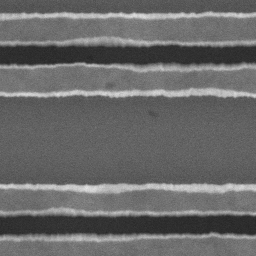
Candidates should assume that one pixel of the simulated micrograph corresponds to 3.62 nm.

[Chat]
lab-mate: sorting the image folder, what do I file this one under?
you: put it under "lines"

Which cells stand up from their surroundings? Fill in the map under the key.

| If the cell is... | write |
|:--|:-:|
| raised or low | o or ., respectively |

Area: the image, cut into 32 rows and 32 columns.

................................
................................
oooooooooooooooooooooooooooooooo
oooooooooooooooooooooooooooooooo
oooooooooooooooooooooooooooooooo
oooooooooooo.oooooooo.oooooooooo
................................
................................
oooooooooooooooooooooooooooooooo
oooooooooooooooooooooooooooooooo
oooooooooooooooooooooooooooooooo
oooooooooooooooooooooooooooooooo
................................
................................
................................
................................
................................
................................
................................
................................
................................
................................
................................
oooooooooooooooooooooooooooooooo
oooooooooooooooooooooooooooooooo
oooooooooooooooooooooooooooooooo
oooooooooooooooooooooooooooooooo
................................
................................
oooooooooooo.ooooooooooooooooooo
oooooooooooooooooooooooooooooooo
oooooooooooooooooooooooooooooooo